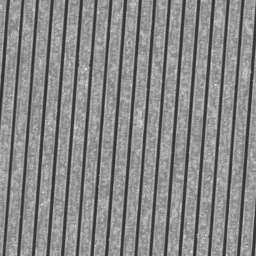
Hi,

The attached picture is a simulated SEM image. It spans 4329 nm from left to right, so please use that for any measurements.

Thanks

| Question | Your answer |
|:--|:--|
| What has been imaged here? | parallel lines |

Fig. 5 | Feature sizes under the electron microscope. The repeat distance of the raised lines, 0.247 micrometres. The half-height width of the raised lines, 183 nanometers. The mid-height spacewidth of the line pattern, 3.61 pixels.